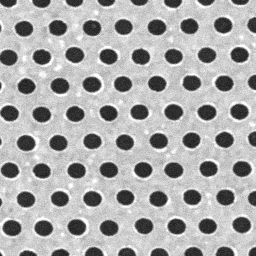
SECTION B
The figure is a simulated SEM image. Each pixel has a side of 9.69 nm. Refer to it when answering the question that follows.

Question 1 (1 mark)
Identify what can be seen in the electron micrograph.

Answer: a regular array of holes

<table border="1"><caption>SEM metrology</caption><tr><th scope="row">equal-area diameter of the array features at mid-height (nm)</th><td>174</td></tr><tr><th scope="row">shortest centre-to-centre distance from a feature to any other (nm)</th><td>309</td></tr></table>